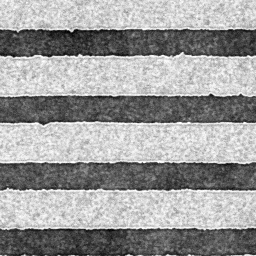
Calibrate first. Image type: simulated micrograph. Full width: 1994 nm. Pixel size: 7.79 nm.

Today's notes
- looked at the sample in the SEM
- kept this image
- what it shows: one or a few lines or trenches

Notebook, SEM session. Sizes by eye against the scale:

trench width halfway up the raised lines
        220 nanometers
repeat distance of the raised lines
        66.7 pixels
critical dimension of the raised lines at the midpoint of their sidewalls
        0.298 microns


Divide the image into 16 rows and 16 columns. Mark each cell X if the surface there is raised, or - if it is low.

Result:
XXXXXXXXXXXXXXXX
XXXXXXXXXXXXXXXX
----------------
-----------X----
XXXXXXXXXXXXXXXX
XXXXXXXXXXXXXXXX
----------------
----------------
XXXXXXXXXXXXXXXX
XXXXXXXXXXXXXXXX
----------------
----------------
XXXXXXXXXXXXXXXX
XXXXXXXXXXXXXXXX
----------------
----------------